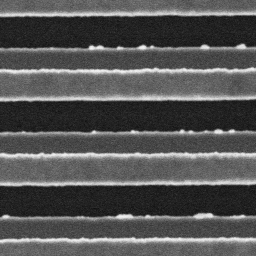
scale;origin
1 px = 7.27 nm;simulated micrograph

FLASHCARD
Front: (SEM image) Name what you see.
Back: lines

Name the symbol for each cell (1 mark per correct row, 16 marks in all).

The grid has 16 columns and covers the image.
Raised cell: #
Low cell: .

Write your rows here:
################
................
................
################
################
################
................
................
################
################
################
################
................
.......#....##..
################
################